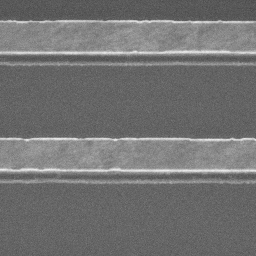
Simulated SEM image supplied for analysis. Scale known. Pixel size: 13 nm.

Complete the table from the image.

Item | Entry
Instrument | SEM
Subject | lines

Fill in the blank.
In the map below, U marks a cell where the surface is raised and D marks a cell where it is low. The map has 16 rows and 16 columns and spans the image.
DDDDDDDDDDDDDDDD
UUUUUUUUUUUUUUUU
UUUUUUUUUUUUUUUU
DDDDDDDDDDDDDDDD
DDDDDDDDDDDDDDDD
DDDDDDDDDDDDDDDD
DDDDDDDDDDDDDDDD
DDDDDDDDDDDDDDDD
DDDDDDDDDDDDDDDD
UUUUUUUUUUUUUUUU
UUUUUUUUUUUUUUUU
DDDDDDDDDDDDDDDD
DDDDDDDDDDDDDDDD
DDDDDDDDDDDDDDDD
DDDDDDDDDDDDDDDD
DDDDDDDDDDDDDDDD